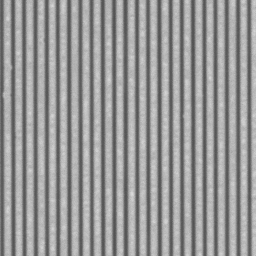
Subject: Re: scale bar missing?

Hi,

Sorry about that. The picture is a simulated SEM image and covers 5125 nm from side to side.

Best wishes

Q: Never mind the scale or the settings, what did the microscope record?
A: parallel lines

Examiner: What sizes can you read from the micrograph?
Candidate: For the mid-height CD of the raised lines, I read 145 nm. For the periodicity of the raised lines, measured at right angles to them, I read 225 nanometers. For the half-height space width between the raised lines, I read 90.1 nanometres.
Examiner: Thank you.